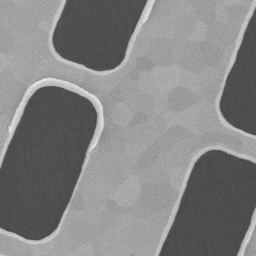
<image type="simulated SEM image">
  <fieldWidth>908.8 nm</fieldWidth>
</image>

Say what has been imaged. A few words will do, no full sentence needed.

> holes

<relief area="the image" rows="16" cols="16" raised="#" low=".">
####.....#######
###......######.
###.....#######.
####....#######.
##############..
##..##########..
##....########..
#.....########..
#.....##########
......#######.##
.....#######....
.....#######....
....#######.....
....#######.....
...#######......
##########.....#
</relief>